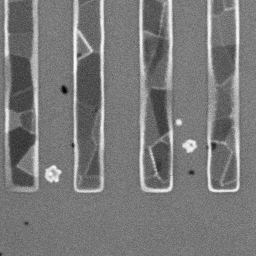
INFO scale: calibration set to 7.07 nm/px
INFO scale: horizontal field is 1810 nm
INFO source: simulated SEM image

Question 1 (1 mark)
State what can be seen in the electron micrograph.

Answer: wiring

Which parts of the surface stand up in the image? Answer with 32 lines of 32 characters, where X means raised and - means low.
-XXX-----XXXX-----XXX-----XXXX--
-XXX-----XXXX-----XXX-----XXXX--
-XXX-----XXXX-----XXX-----XXXX--
-XXX-----XXXX-----XXX-----XXXX--
-XXX-----XXXX-----XXX-----XXXX--
-XXX-----XXXX-----XXX-----XXXX--
-XXX-----XXXX-----XXX-----XXXX--
-XXX-----XXXX-----XXX-----XXXX--
-XXX-----XXXX-----XXX-----XXXX--
-XXX-----XXXX-----XXX-----XXXX--
-XXX-----XXXX-----XXX-----XXX---
-XXX-----XXXX-----XXX------XX---
-XXX-----XXXX-----XXX------XX---
-XXX-----XXXX-----XXX-----XXX---
-XXX-----XXXX-----XXX-----XXX---
-XXX-----XXXX-----XXX-----XXXX--
-XXXX----XXXX-----XXX-----XXXX--
-XXXX----XXXX-----XXX-----XXXX--
-XXX-----XXXX-----XXX-----XXXX--
-XXX------XXX-----XXXX----XXXX--
-XXX------XXX-----XXXX----XXXX--
-XXX--X--XXXX-----XXX-----XXXX--
-XXX-----XXXX-----XXX-----XXXX--
--XX------XXX-----XXX-----XXXX--
--------------------------------
--------------------------------
--------------------------------
--------------------------------
--------------------------------
--------------------------------
--------------------------------
--------------------------------